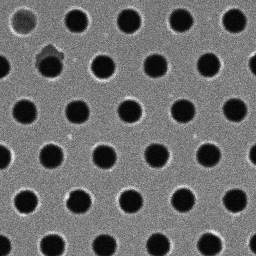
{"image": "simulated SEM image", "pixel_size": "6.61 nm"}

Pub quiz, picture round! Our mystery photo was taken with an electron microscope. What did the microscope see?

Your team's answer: a regular array of holes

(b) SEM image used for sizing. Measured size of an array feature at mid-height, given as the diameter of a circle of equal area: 0.149 microns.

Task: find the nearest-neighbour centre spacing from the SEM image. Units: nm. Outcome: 342